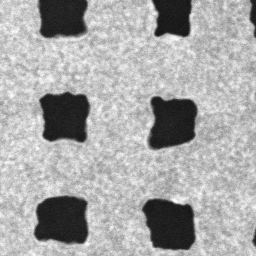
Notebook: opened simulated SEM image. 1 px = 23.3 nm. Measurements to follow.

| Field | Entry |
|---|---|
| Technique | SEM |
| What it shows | holes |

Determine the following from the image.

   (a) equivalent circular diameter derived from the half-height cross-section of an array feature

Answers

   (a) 1220 nanometres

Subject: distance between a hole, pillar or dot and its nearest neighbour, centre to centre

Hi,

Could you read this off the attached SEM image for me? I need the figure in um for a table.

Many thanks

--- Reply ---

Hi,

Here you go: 2.39